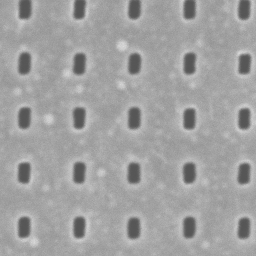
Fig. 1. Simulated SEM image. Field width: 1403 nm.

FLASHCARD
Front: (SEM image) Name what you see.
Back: a regular array of holes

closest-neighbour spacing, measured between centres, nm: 298